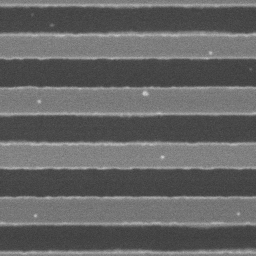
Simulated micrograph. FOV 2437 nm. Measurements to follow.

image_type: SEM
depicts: lines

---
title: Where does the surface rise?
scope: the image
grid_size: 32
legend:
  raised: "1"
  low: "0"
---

11111111111111111111111111111111
00000000000000000000000000000000
00000000000000000000000000000000
00000000000000000000000000000000
11111111111111111111111111111111
11111111111111111111111111111111
11111111111111111111111111111111
00000000000000000000000000000000
00000000000000000000000000000000
00000000000000000000000000000000
00000000000000000000000000000000
11111111111111111111111111111111
11111111111111111111111111111111
11111111111111111111111111111111
00000000000000000000000000000000
00000000000000000000000000000000
00000000000000000000000000000000
00000000000000000000000000000000
11111111111111111111111111111111
11111111111111111111111111111111
11111111111111111111111111111111
00000000000000000000000000000000
00000000000000000000000000000000
00000000000000000000000000000000
00000000000000000000000000000000
11111111111111111111111111111111
11111111111111111111111111111111
11111111111111111111111111111111
00000000000000000000000000000000
00000000000000000000000000000000
00000000000000000000000000000000
00000000000000000000000000000000